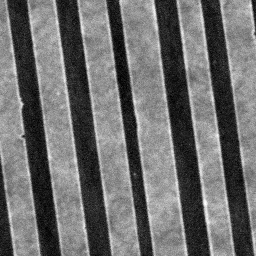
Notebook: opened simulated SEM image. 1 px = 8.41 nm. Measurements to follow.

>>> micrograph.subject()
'parallel lines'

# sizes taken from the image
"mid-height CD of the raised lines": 226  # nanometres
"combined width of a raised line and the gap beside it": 407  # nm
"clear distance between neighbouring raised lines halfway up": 179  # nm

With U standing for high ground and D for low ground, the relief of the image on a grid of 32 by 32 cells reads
UDDDUUUDDDUUUDDUUUUDDDUUUDDDUUUD
UDDDUUUDDDUUUDDUUUUDDDUUUDDDUUUD
UDDDUUUDDDUUUUDUUUUUDDDUUDDDUUUU
UDDDUUUDDDUUUUDUUUUUDDDUUDDDUUUU
UDDDUUUDDDUUUUDDUUUUDDDUUUDDUUUU
UDDDUUUUDDUUUUDDUUUUDDDUUUDDUUUU
UUDDUUUUDDDUUUDDUUUUDDDUUUDDUUUU
UUDDUUUUDDDUUUDDUUUUDDDUUUDDDUUU
UUDDDUUUDDDUUUDDUUUUDDDUUUDDDUUU
UUDDDUUUDDDUUUUDUUUUDDDUUUDDDUUU
UUDDDUUUDDDUUUUDDUUUDDDDUUDDDUUU
UUDDDUUUDDDUUUUDDUUUUDDDUUDDDUUU
UUUDDUUUDDDUUUUDDUUUUDDDUUUDDUUU
UUUDDUUUUDDDUUUDDUUUUDDDUUUDDUUU
UUUDDUUUUDDDUUUDDUUUUDDDUUUDDDUU
UUUDDDUUUDDDUUUDDUUUUDDDUUUDDDUU
UUUDDDUUUDDDUUUDDUUUUDDDUUUDDDUU
UUUDDDUUUDDDUUUUDUUUUDDDUUUDDDUU
UUUDDDUUUDDDUUUUDUUUUUDDDUUDDDUU
UUUDDDUUUDDDUUUUDDUUUUDDDUUUDDUU
UUUUDDUUUUDDUUUUDDUUUUDDDUUUDDUU
UUUUDDUUUUDDDUUUDDUUUUDDDUUUDDUU
DUUUDDUUUUDDDUUUDDUUUUDDDUUUDDDU
DUUUDDDUUUDDDUUUDDUUUUDDDUUUDDDU
DUUUDDDUUUDDDUUUUDUUUUDDDDUUDDDU
DUUUDDDUUUDDDUUUUDUUUUDDDDUUDDDU
DUUUDDDUUUDDDUUUUDDUUUUDDDUUUDDU
DUUUDDDUUUUDDUUUUDDUUUUDDDUUUDDU
DUUUUDDUUUUDDDUUUDDUUUUDDDUUUDDU
DDUUUDDUUUUDDDUUUDDUUUUDDDUUUDDD
DDUUUDDDUUUDDDUUUDDUUUUDDDUUUDDD
DDUUUDDDUUUDDDUUUDDUUUUDDDUUUDDD